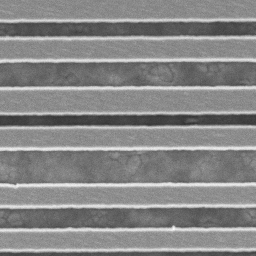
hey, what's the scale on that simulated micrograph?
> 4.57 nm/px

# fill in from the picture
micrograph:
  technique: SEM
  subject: parallel lines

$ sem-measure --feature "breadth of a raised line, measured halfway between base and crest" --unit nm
107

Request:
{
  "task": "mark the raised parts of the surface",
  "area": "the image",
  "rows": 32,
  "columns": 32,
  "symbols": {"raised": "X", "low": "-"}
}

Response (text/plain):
XXXXXXXXXXXXXXXXXXXXXXXXXXXXXXXX
XXXXXXXXXXXXXXXXXXXXXXXXXXXXXXXX
XXXXXXXXXXXXXXXXXXXXXXXXXXXXXXXX
--------------------------------
--------------------------------
XXXXXXXXXXXXXXXXXXXXXXXXXXXXXXXX
XXXXXXXXXXXXXXXXXXXXXXXXXXXXXXXX
XXXXXXXXXXXXXXXXXXXXXXXXXX--XXXX
--------------------------------
--------------------------------
--------------------------------
XXXXXXXXXXXXXXXXXXXXXXXXXXXXXXXX
XXXXXXXXXXXXXXXXXXXXXXXXXXXXXXXX
XXXXXXXXXXXXXXXXXXXXXXXXXXXXXXXX
--------------------------------
--------------------------------
XXXXXXXXXXXXXXXXXXXXXXXXXXXXXXXX
XXXXXXXXXXXXXXXXXXXXXXXXXXXXXXXX
XXXXXXXXXXXXXXXXXXXXXXXXXXXXXXXX
--------------------------------
--------------------------------
--------------------------------
--------------------------------
XXXXXXXXXXXXXXXXXXXXXXXXXXXXXXXX
XXXXXXXXXXXXXXXXXXXXXXXXXXXXXXXX
XXXXXXXXXXXXXXXXXXXXXXXXXXXXXXXX
--------------------------------
--------------------------------
---------------------X----------
XXXXXXXXXXXXXXXXXXXXXXXXXXXXXXXX
XXXXXXXXXXXXXXXXXXXXXXXXXXXXXXXX
--------------------------------